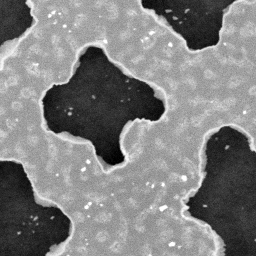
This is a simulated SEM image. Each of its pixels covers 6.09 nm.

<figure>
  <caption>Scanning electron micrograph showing holes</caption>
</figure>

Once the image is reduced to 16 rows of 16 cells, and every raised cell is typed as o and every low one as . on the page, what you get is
..ooooooo.....oo
..oooooooo....oo
.ooooooooooo..oo
ooooo..ooooooooo
ooooo...oooooooo
ooo......ooooooo
ooo.......oooooo
ooo.....o.oooooo
oooo....ooooo..o
oooooo..ooooo...
.oooooooooooo...
..ooooooooooo...
..oooooooooo....
....oooooooo....
....ooooooooo...
....oooooooooo..